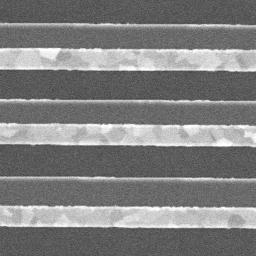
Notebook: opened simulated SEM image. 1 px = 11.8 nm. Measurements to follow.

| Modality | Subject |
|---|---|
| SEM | lines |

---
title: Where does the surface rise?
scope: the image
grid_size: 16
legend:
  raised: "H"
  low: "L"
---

LLLLLLLLLLLLLLLL
LLLLLLLLLLLLLLLL
HHHHHHHHHHHHHHHH
HHHHHHHHHHHHHHHH
LLLLLLLLLLLLLLLL
LLLLLLLLLLLLLLLL
HHHHHHHHHHHHHHHH
HHHHHHHHHHHHHHHH
HHHHHHHHHHHHHHHH
LLLLLLLLLLLLLLLL
LLLLLLLLLLLLLLLL
HHHHHHHHHHHHHHHH
HHHHHHHHHHHHHHHH
HHHHHHHHHHHHHHHH
LLLLLLLLLLLLLLLL
LLLLLLLLLLLLLLLL